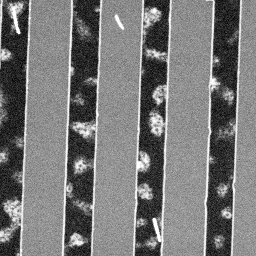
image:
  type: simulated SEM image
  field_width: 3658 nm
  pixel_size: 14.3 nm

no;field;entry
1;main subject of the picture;one or a few lines or trenches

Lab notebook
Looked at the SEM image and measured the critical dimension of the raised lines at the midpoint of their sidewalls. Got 405 nanometres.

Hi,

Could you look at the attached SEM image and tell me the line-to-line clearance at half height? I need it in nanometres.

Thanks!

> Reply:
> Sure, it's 600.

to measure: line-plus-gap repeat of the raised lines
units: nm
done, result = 1000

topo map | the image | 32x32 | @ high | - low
@@@@-----@@@@-----@@@------@@@--
@@@@-----@@@@-----@@@------@@@--
@@@@-----@@@@-----@@@------@@@--
@@@@-----@@@------@@@------@@@--
@@@@-----@@@------@@@------@@@--
@@@@-----@@@------@@@------@@@--
@@@------@@@------@@@------@@@--
@@@------@@@------@@@------@@@--
@@@------@@@------@@@-----@@@@--
@@@------@@@------@@@-----@@@@--
@@@------@@@-----@@@@-----@@@@--
@@@------@@@-----@@@@-----@@@@--
@@@------@@@-----@@@@-----@@@@--
@@@------@@@-----@@@@-----@@@@--
@@@------@@@-----@@@@-----@@@@--
@@@------@@@-----@@@@-----@@@@--
@@@-----@@@@-----@@@@-----@@@@--
@@@-----@@@@-----@@@@-----@@@@--
@@@-----@@@@-----@@@@-----@@@---
@@@-----@@@@-----@@@@-----@@@---
@@@-----@@@@-----@@@@-----@@@---
@@@-----@@@@-----@@@@-----@@@---
@@@-----@@@@-----@@@@-----@@@---
@@@-----@@@@-----@@@------@@@---
@@@-----@@@@-----@@@------@@@---
@@@-----@@@@-----@@@------@@@---
@@@-----@@@@-----@@@------@@@---
@@@-----@@@@-----@@@------@@@---
@@@-----@@@@-----@@@------@@@---
@@@-----@@@@-----@@@------@@@---
@@@-----@@@------@@@------@@@---
@@@-----@@@------@@@------@@@---